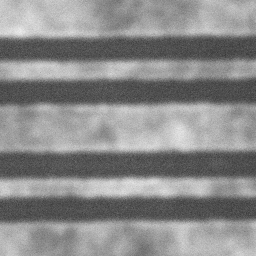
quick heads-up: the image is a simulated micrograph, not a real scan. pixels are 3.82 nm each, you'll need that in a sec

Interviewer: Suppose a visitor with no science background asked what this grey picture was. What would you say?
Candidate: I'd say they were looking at lines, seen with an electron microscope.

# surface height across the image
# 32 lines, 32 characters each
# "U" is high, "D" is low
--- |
UUUUUUUUUUUUUUUUUUUUUUUUUUUUUUUU
UUUUUUUUUUUUUUUUUUUUUUUUUUUUUUUU
UUUUUUUUUUUUUUUUUUUUUUUUUUUUUUUU
UUUUUUUUUUUUUUUUUUUUUUUUUUUUUUUU
DDDDDDDDDDDDDDDDDDDDDDDDDDDDDDDD
DDDDDDDDDDDDDDDDDDDDDDDDDDDDDDDD
DDDDDDDDDDDDDDDDDDDDDDDDDDDDDDDD
DDDDDDDDDDDDDDDDDDDDDDDDDDDDDDDD
UUUUUUUUUUUUUUUUUUUUUUUUUUUUUUUU
UUUUUUUUUUUUUUUUUUUUUUUUUUUUUUUU
DDDDDDDDDDDDDDDDDDDDDDDDDDDDDDDD
DDDDDDDDDDDDDDDDDDDDDDDDDDDDDDDD
DDDDDDDDDDDDDDDDDDDDDDDDDDDDDDDD
UUUUUUUUUUUUUUUUUUUUUUUUUUUUUUUU
UUUUUUUUUUUUUUUUUUUUUUUUUUUUUUUU
UUUUUUUUUUUUUUUUUUUUUUUUUUUUUUUU
UUUUUUUUUUUUUUUUUUUUUUUUUUUUUUUU
UUUUUUUUUUUUUUUUUUUUUUUUUUUUUUUU
UUUUUUUUUUUUUUUUUUUUUUUUUUUUUUUU
DDDDDDDDDDDDDDDDDDDDDDDDDDDDDDDD
DDDDDDDDDDDDDDDDDDDDDDDDDDDDDDDD
DDDDDDDDDDDDDDDDDDDDDDDDDDDDDDDD
DDDDDDDDDDDDDDDUUUUUUUUUUUUUUUUU
UUUUUUUUUUUUUUUUUUUUUUUUUUUUUUUU
DDDDDDDDDDDDDDDDDDDDDDDDDDDDDDDD
DDDDDDDDDDDDDDDDDDDDDDDDDDDDDDDD
DDDDDDDDDDDDDDDDDDDDDDDDDDDDDDDD
DDDDDDDDDDDDDDDDDDDDDDDDDDDDDDDD
UUUUUUUUUUUUUUUUUUUUUUUUUUUUUUUU
UUUUUUUUUUUUUUUUUUUUUUUUUUUUUUUU
UUUUUUUUUUUUUUUUUUUUUUUUUUUUUUUU
UUUUUUUUUUUUUUUUUUUUUUUUUUUUUUUU